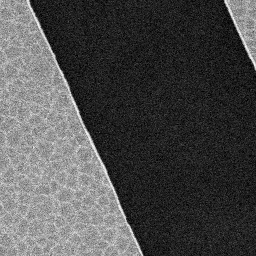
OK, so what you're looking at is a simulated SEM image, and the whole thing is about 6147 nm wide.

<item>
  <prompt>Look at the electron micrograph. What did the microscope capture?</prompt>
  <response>one or a few lines or trenches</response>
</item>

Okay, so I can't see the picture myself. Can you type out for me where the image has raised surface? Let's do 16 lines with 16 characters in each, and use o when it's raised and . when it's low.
oo............oo
oo.............o
ooo............o
ooo.............
oooo............
oooo............
ooooo...........
ooooo...........
oooooo..........
oooooo..........
oooooo..........
ooooooo.........
ooooooo.........
oooooooo........
oooooooo........
ooooooooo.......